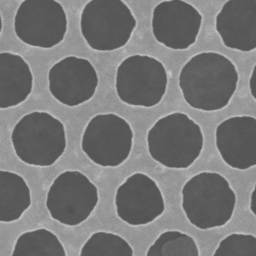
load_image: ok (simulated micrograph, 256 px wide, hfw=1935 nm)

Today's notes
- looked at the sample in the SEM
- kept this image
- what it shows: a regular array of holes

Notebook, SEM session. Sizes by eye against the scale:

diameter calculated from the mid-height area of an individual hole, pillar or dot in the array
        398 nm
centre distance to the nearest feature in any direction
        67.6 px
